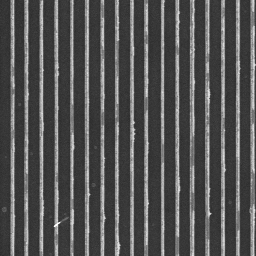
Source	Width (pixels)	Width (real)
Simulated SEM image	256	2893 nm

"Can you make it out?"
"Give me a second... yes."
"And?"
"parallel lines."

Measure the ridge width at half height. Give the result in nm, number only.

38.1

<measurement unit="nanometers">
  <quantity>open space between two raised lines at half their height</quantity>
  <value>128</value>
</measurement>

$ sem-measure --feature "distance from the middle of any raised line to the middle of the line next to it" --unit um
0.17